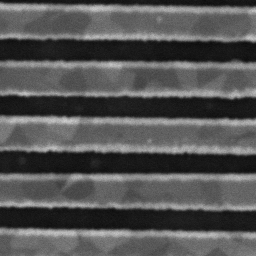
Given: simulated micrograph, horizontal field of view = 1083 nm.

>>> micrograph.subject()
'lines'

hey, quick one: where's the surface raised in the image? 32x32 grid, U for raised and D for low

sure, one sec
UDDDDDDDDDDDDDDDDDDDDDDDDDDDDDDD
UUUUUUUUUUUUUUUUUUUUUUUUUUUUUUUU
UUUUUUUUUUUUUUUUUUUUUUUUUUUUUUUU
UUUUUUUUUUUUUUUUUUUUUUUUUUUUUUUU
UUUUUUUUUUUUUUUUUUUUUUUUUUUUUUUU
DDDDDDDDDDDDDDDDDDDDDDDDDDDDDDDD
DDDDDDDDDDDDDDDDDDDDDDDDDDDDDDDD
DDDDDDDDDDDDDDDDDDDDDDDDDDDDDDDD
UUUUUUUUUUUUUUUUUUUUUUUUUUUUUUUU
UUUUUUUUUUUUUUUUUUUUUUUUUUUUUUUU
UUUUUUUUUUUUUUUUUUUUUUUUUUUUUUUU
UUUUUUUUUUUUUUUUUUUUUUUUUUUUUUUU
DDDDDDDDDDDDDDDDDDDDDDDDDDDDDDDD
DDDDDDDDDDDDDDDDDDDDDDDDDDDDDDDD
DDDDDDDDDDDDDDDDDDDDDDDDDDDDDDDD
UUUUUUUUUUUUUUUUUUUUUUUUUUUUUUUU
UUUUUUUUUUUUUUUUUUUUUUUUUUUUUUUU
UUUUUUUUUUUUUUUUUUUUUUUUUUUUUUUU
UUUUUUUUUUUUUUUUUUUUUUUUUUUUUUUU
DDDDDDDDDDDDDDDDDDDDDDDDDDDDDDDD
DDDDDDDDDDDDDDDDDDDDDDDDDDDDDDDD
DDDDDDDDDDDDDDDDDDDDDDDDDDDDDDDD
UUUUUUUUUUUUUUUUUUUUUUUUUUUUUUUU
UUUUUUUUUUUUUUUUUUUUUUUUUUUUUUUU
UUUUUUUUUUUUUUUUUUUUUUUUUUUUUUUU
UUUUUUUUUUUUUUUUUUUUUUUUUUUUUUUU
DDDDDDDDDDDDDDDDDDDDDDDDDDDDDDDD
DDDDDDDDDDDDDDDDDDDDDDDDDDDDDDDD
DDDDDDDDDDDDDDDDDDDDDDDDDDDDDDDD
UUUUUUUUUUUUUUUUUUUUUUUUUUUUUUUU
UUUUUUUUUUUUUUUUUUUUUUUUUUUUUUUU
UUUUUUUUUUUUUUUUUUUUUUUUUUUUUUUU